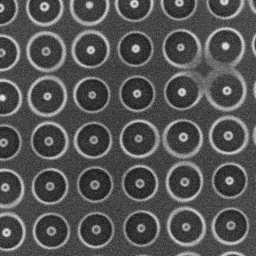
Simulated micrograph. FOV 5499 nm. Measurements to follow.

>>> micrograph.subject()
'an array of small figures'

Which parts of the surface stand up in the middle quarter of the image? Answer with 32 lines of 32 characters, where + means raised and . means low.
+++++...+++++++++++++++++++++..+
++++++++++++++++++++++++++++++++
+++++++++++++++++++++++++++++..+
+++++++++++++++++..++++++++.....
++++......+++++......+++++......
+++.......+++++.......++++......
+++........+++........+++....+..
+++...++...+++....+...+++....+..
+++........+++........++++......
+++........++++.......++++......
++++......++++++.....++++++.....
+++++....++++++++..+++++++++++++
++++++++++++++++++++++++++++++++
++++++++++++++++++++++++++++++++
++++++++++++++++++..++++++++...+
+++++.....++++++......+++++.....
++++.......++++........+++......
+++........++++........++.......
.++....+....++....+.....+....++.
.++....+....++.........++.......
.++........++++........+++......
++++.......++++.......+++++.....
+++++.....+++++++....+++++++....
++++++++++++++++++++++++++++++++
++++++++++++++++++++++++++++++++
++++++++++++++++++++++++++++....
++++++....+++++++....++++++.....
+++++......++++.......++++......
++++........+++........+++......
.+++...+....+++...++...+++...++.
.+++...++...+++...++...+++......
.+++........+++........+++......